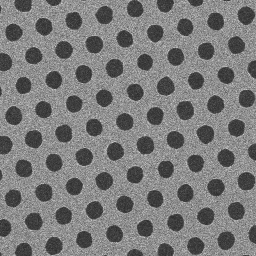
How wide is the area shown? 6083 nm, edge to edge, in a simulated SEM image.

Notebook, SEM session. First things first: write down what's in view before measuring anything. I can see a regular array of holes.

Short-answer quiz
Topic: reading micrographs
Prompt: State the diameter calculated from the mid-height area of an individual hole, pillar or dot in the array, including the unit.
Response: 17.6 px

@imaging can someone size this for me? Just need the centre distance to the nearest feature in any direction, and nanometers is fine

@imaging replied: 729